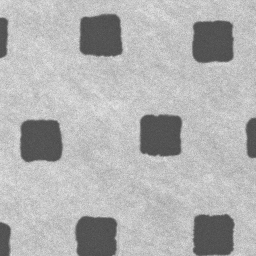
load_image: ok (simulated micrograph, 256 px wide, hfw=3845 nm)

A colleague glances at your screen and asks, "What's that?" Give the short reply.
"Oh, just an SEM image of holes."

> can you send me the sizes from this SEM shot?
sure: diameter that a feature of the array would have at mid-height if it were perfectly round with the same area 0.686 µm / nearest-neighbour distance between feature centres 1650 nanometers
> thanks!